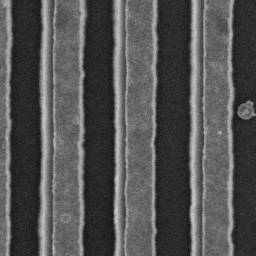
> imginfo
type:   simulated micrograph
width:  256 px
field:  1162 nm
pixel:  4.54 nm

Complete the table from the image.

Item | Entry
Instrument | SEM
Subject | lines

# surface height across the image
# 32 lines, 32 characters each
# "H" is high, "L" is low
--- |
HLLLLLHHHHLLLLLHHHHLLLLLHHHHHLLL
HLLLLHHHHHLLLLLHHHHLLLLLHHHHHLLL
HLLLLLHHHHLLLLLHHHHLLLLLHHHHHLLL
HLLLLLHHHHLLLLLHHHHLLLLLHHHHHLLL
HLLLLLHHHHLLLLLHHHHLLLLLHHHHHLLL
HLLLLHHHHHLLLLLHHHHLLLLLHHHHHLLL
HLLLLHHHHHLLLLLHHHHLLLLLHHHHHLLL
HLLLLHHHHHLLLLLHHHHLLLLLHHHHHLLL
HLLLLHHHHHLLLLLHHHHLLLLLHHHHHLLL
HLLLLHHHHHLLLLLHHHHLLLLLHHHHHLLL
HLLLLHHHHHLLLLLHHHHLLLLLHHHHHLLL
HLLLLHHHHHLLLLLHHHHLLLLLHHHHHLLL
HLLLLHHHHHLLLLLHHHHLLLLLHHHHHLLL
HLLLLHHHHHLLLLLHHHHLLLLLHHHHHLLL
HLLLLHHHHHLLLLLHHHHLLLLLHHHHHLLL
HLLLLHHHHHLLLLLHHHHLLLLLHHHHHLLL
HLLLLHHHHHLLLLLHHHHLLLLLHHHHHLLL
HLLLLLHHHHLLLLLHHHHLLLLLHHHHHLLL
HLLLLHHHHHLLLLLHHHHLLLLLHHHHHLLL
HLLLLHHHHHLLLLLHHHHLLLLLHHHHHLLL
HLLLLHHHHHLLLLLHHHHLLLLLHHHHHLLL
HLLLLHHHHHLLLLLHHHHLLLLLHHHHHLLL
HLLLLHHHHHLLLLHHHHHLLLLLHHHHHLLL
HLLLLHHHHHLLLLHHHHHLLLLLHHHHHLLL
HLLLLHHHHHLLLLLHHHHLLLLLHHHHHLLL
HLLLLHHHHHLLLLLHHHHLLLLLHHHHHLLL
HLLLLHHHHHLLLLHHHHHLLLLLHHHHHLLL
HLLLLHHHHHLLLLHHHHHLLLLLHHHHHLLL
HLLLLHHHHHLLLLLHHHHLLLLLHHHHHLLL
HLLLLHHHHHLLLLLHHHHLLLLLHHHHHLLL
HLLLLHHHHHLLLLLHHHHLLLLLHHHHHLLL
HLLLLHHHHHLLLLLHHHHLLLLLHHHHHLLL